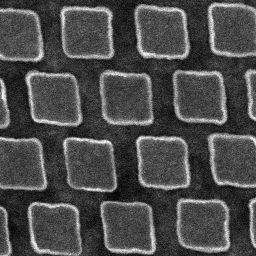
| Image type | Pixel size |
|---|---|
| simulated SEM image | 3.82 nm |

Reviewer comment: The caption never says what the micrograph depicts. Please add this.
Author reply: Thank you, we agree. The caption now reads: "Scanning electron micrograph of a regular array of raised bodies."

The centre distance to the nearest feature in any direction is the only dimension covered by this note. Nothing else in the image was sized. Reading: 280 nm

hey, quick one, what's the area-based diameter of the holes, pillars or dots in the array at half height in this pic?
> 214 nm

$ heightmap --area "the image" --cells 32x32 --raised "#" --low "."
...........................##...
####....######...######...######
#####...######...######...######
#####...######...######...######
#####...######...######...######
#####...######...#######..######
#####...######....#####....#####
...##...........................
................................
...######....#####....######...#
...#######...######...######...#
#...######...######...######...#
#...######...######...######...#
#...######...######...######...#
#...######...######...######...#
#......###.......#..............
................................
####....####.....######...######
#####...######...######...######
#####...######...######...######
#####...######...######...######
#####...######...#######...#####
######...######..#######...#####
.####....#####..................
................................
....##.#.....#####....######...#
#...######...######...######...#
#...######...######...######...#
#...######...######...######...#
#...######...######...#######..#
#...######...######....######...
#....#####.....#.##.............